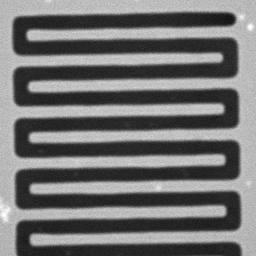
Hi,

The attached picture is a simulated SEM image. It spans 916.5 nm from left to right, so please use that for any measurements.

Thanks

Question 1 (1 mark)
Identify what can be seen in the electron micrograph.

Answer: groups of lines, slits or small figures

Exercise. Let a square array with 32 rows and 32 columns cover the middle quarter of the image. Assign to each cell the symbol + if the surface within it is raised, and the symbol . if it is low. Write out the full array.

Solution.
................................
................................
................................
................................
++++++++++++++++++++++++++++++++
++++++++++++++++++++++++++++++++
++++++++++++++++................
................................
................................
................................
............++......++++++++++++
++++++++++++++++++++++++++++++++
++++++++++++++++++++++++++++++++
................................
................................
................................
.........................+++++++
++++++++++++++++++++++++++++++++
++++++++++++++++++++++++++++++++
................................
................................
................................
................................
++++++++++++++++++++++++++++++++
++++++++++++++++++++++++++++++++
+++++++++++++++++++++++++++.....
................................
................................
................................
.....................+++++++++++
++++++++++++++++++++++++++++++++
++++++++++++++++++++++++++++++++